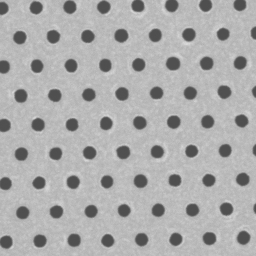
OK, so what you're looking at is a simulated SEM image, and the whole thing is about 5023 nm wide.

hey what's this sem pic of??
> a regular array of holes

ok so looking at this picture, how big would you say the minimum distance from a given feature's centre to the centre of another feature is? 655 nm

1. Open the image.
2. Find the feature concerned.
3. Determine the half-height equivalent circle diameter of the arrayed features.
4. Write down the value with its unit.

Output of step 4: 264 nanometers